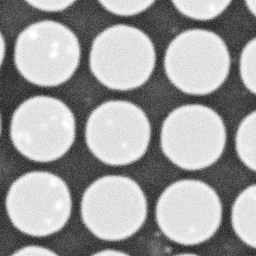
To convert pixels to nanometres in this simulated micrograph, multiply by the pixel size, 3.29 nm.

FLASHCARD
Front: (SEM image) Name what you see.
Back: an array of small figures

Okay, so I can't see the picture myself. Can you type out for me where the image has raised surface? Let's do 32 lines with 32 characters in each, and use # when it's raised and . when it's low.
....#####....######...######...#
..............###......####.....
................................
....####......##................
...######....#####.....####.....
..########..#######...######...#
..########..#######..#######...#
..########.########..########.##
..#######...#######..#######..##
...######...######...#######..##
.....##......####.....#####....#
.......................###......
....###.........................
...#####....#####......###......
..#######..#######...######....#
..#######..#######...#######..##
..#######..########.########..##
..#######..########.########..##
..######...#######..########..##
...####.....#####....######...##
..............#.......####.....#
................................
..#####.....####................
..######...######....#####.....#
.########..#######..#######...##
.########.########..#######..###
.########.########..########.###
..######...#######..#######..###
..#####....######...#######..###
............####.....#####....##
...............................#
...###.......#..................